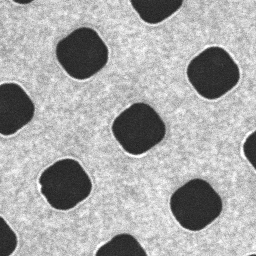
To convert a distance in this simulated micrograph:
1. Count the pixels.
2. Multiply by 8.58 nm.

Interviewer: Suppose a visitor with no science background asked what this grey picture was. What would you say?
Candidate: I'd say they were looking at holes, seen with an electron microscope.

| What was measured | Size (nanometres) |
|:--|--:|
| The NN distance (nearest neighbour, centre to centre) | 797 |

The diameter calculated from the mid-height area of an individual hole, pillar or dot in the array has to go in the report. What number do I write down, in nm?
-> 436